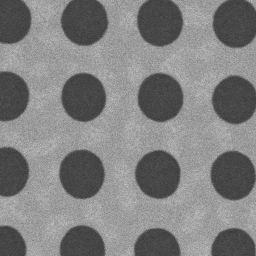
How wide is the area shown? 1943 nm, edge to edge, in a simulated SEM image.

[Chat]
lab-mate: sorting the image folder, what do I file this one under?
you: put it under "holes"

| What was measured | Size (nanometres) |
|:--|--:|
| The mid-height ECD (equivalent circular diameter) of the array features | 355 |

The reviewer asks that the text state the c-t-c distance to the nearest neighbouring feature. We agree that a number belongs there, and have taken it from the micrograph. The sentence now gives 581 nm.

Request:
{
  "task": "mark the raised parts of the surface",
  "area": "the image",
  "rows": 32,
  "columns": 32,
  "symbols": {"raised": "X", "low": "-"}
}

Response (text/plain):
---XXXXX-----XXXXX----XXXXXX---X
----XXXX-----XXXX------XXXX-----
----XXXX-----XXXX------XXXX-----
----XXXX-----XXXX------XXXX-----
---XXXXX-----XXXXX----XXXXX-----
XXXXXXXXX--XXXXXXXX--XXXXXXX---X
XXXXXXXXXXXXXXXXXXXXXXXXXXXXXXXX
XXXXXXXXXXXXXXXXXXXXXXXXXXXXXXXX
XXXXXXXXXXXXXXXXXXXXXXXXXXXXXXXX
--XXXXXXX---XXXXXXX--XXXXXXXX-XX
---XXXXX-----XXXXX----XXXXX----X
----XXXX-----XXXX------XXXX-----
----XXXX-----XXXX------XXX------
---XXXXX-----XXXX------XXXX-----
--XXXXXXX---XXXXXX----XXXXX----X
XXXXXXXXXXXXXXXXXXXXXXXXXXXXX-XX
XXXXXXXXXXXXXXXXXXXXXXXXXXXXXXXX
XXXXXXXXXXXXXXXXXXXXXXXXXXXXXXXX
--XXXXXXXXXXXXXXXXXXXXXXXXXXXXXX
---XXXXX----XXXXXX----XXXXX----X
---XXXXX-----XXXX-----XXXXX-----
----XXX------XXXX------XXX------
---XXXXX-----XXXX-----XXXX------
---XXXXX-----XXXX-----XXXXX-----
--XXXXXXX---XXXXXXX--XXXXXXX---X
XXXXXXXXXXXXXXXXXXXXXXXXXXXXXXXX
XXXXXXXXXXXXXXXXXXXXXXXXXXXXXXXX
XXXXXXXXXXXXXXXXXXXXXXXXXXXXXXXX
--XXXXXXX--XXXXXXXXXXXXXXXXXXXXX
---XXXXX-----XXXXX----XXXXX----X
---XXXXX-----XXXX-----XXXXX-----
---XXXXX-----XXXX------XXX------